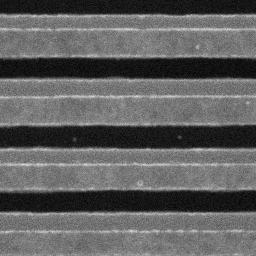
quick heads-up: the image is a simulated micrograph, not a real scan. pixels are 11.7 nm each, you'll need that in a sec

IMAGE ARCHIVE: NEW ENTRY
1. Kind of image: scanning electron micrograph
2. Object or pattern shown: lines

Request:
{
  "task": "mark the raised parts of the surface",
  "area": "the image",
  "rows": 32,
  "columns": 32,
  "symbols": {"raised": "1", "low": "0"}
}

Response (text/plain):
00000000000000000000000000000000
00000000000000000000000000000000
11111111111111111111111111111111
11111111111111111111111111111111
11111111111111111111111111111111
11111111111111111111111111111111
11111111111111111111111111111111
00000000000000000000000000000000
00000000000000000000000000000000
00000000000000000000000000000000
11111111111111111111111111111111
11111111111111111111111111111111
11111111111111111111111111111111
11111111111111111111111111111111
11111111111111111111111111111111
11111111011101111111010111110010
00000000000000000000000000000000
00000000000000000000000000000000
00000000000000000000000000000000
11111111111111111111111111111111
11111111111111111111111111111111
11111111111111111111111111111111
11111111111111111111111111111111
11111111111111111111111111111111
00000000000000000000000000000000
00000000000000000000000000000000
00000000000000000000000000000000
11111111111111111111111111111111
11111111111111111111111111111111
11111111111111111111111111111111
11111111111111111111111111111111
11111111111111111111111111111111